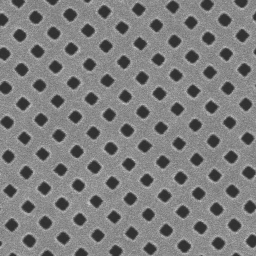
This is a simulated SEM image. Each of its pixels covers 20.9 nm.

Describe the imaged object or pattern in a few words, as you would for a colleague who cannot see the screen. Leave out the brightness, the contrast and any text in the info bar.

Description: a regular array of holes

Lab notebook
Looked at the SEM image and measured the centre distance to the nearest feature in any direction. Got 23.8 px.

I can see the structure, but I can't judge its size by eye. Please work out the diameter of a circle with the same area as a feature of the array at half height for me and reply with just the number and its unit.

266 nm